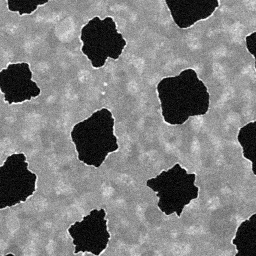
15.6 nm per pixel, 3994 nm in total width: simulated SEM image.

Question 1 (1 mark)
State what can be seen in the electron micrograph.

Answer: holes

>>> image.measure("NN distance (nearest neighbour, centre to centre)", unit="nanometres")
1460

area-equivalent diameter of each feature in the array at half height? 0.741 µm